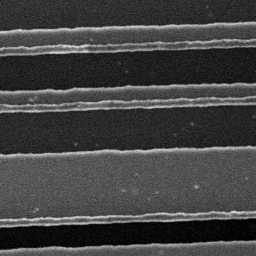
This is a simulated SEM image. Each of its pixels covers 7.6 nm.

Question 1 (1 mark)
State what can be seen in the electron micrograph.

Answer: lines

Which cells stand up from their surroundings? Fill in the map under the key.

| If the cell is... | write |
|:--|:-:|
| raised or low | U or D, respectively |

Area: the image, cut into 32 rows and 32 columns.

DDDDDDDDDDDDDDDDDDDDDDDDDDDDDDDD
DDDDDDDDDDDDDDDDDDDDDDDDDDDDDDDD
DDDDDDDDDDDDDDDDDDDDDDDDDDDDDDDD
DDDDDDDDDDUUUUUUUUUUUUUUUUUUUUUU
UUUUUUUUUUUUUUUUUUUUUUUUUUUUUUUU
UUUUUUUUUUUUUUUUUUUUUUUUUUUUUUUU
UUUUUUUUUUUUUDUDDDDDDDDDDDDDDDDD
DDDDDDDDDDDDDDDDDDDDDDDDDDDDDDDD
DDDDDDDDDDDDDDDDDDDDDDDDDDDDDDDD
DDDDDDDDDDDDDDDDDDDDDDDDDDDDDDDD
DDDDDDDDDDDDDDDDDDDDDDDDDDUDUUUU
DDUUUUUUUUUUUUUUUUUUUUUUUUUUUUUU
UUUUUUUUUUUUUUUUUUUUUUUUUUUUUUUU
UUUUUUUUUUUUUUUUUDUDDDDDDDDDDDDD
DDDDDDDDDDDDDDDDDDDDDDDDDDDDDDDD
DDDDDDDDDDDDDDDDDDDDDDDDDDDDDDDD
DDDDDDDDDDDDDDDDDDDDDDDDDDDDDDDD
DDDDDDDDDDDDDDDDDDDDDDDDDDDDDDDD
DDDDDDDDDDDDDDDDDDDDDDDDDDUUUUUU
UUUUUUUUUUUUUUUUUUUUUUUUUUUUUUUU
UUUUUUUUUUUUUUUUUUUUUUUUUUUUUUUU
UUUUUUUUUUUUUUUUUUUUUUUUUUUUUUUU
UUUUUUUUUUUUUUUUUUUUUUUUUUUUUUUU
UUUUUUUUUUUUUUUUUUUUUUUUUUUUUUUU
UUUUUUUUUUUUUUUUUUUUUUUUUUUUUUUU
UUUUUUUUUUUUUUUUUUUUUUUUUUUUUUUU
UUUUUUUUUUUUUUUUUUUUUUUUUUUUUUUU
UUUUUUUUUUUUUUUUUUUUUUUUDDDDDDDD
DDDDDDDDDDDDDDDDDDDDDDDDDDDDDDDD
DDDDDDDDDDDDDDDDDDDDDDDDDDDDDDDD
DDDDDDDDDDDDDDDDDDDDDDDDUUUUUUUU
UUUUUUUUUUUUUUUUUUUUUUUUUUUUUUUU